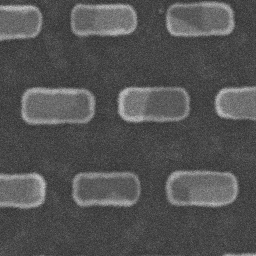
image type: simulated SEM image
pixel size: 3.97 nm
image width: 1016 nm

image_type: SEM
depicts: raised bodies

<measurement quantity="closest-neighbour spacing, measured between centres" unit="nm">380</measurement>